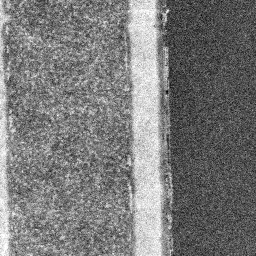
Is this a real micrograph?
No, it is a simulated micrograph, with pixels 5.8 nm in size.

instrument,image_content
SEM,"one or a few lines or trenches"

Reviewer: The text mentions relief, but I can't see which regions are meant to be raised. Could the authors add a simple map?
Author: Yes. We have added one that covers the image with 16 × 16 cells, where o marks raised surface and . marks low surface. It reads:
ooooooooo.......
ooooooooo.......
ooooooooo.......
ooooooooo.......
ooooooooo.......
ooooooooo.......
ooooooooo.......
ooooooooo.......
ooooooooo.......
ooooooooo.......
ooooooooo.......
ooooooooo.......
ooooooooo.......
ooooooooo.......
ooooooooo.......
ooooooooo.......